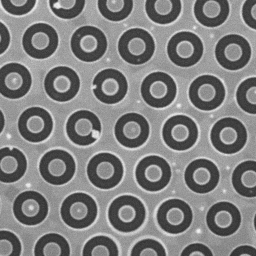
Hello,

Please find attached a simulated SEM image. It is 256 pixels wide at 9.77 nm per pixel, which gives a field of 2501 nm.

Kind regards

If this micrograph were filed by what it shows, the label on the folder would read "an array of small figures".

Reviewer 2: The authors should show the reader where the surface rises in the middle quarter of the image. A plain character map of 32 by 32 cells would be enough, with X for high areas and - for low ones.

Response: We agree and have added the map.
XXXXXXXXXXXXXXXXXXXXXXXXXXXXX---
--XXXXXXXX----XXXXXXXXXXXXXXXXXX
---XXXXX-------XXXXXX-----XXXXXX
----XXX--------XXXXX-------XXXXX
X---XXX---XXX---XXXX--------XXXX
X---XXX---XXX---XXX---XXX---XXX-
X---XXX---XXX---XXX---XXX---XXX-
---XXXX----X----XXX---XXX---XXX-
--XXXXXX-------XXXXX--------XXX-
XXXXXXXXX-----XXXXXX-------XXXXX
XXXXXXXXXXXXXXXXXXXXXX----XXXXXX
XXXX-XXXXXXXXXXXXXXXXXXXXXXXXXXX
XX------XXXXXXX----XXXXXXXXX--XX
X-------XXXXXX------XXXXXX------
X--XXX---XXXX---X----XXXX-------
---XXXX--XXXX--XXXX--XXXX---XX--
---XXXX--XXX---XXXX---XX---XXXX-
X---XX-XXXXXX--XXXX---XX---XXXX-
X-------XXXXX--------XXX----XX--
XX------XXXXX--------XXXX-------
XXX---XXXXXXXX------XXXXXX------
XXXXXXXXXXXXXXXXXXXXXXXXXXX----X
--XXXXXX-----XXXXXXXXXXXXXXXXXXX
---XXXX-------XXXXXX-----XXXXXXX
---XXX---------XXXX-------XXXXXX
---XXX---XXX---XXX---------XXXX-
---XXX--XXXX---XXX---XXX---XXX--
---XXX--XXXX---XXX--XXXX---XXX--
--XXXX---XX----XXX---XXX---XXX--
-XXXXXX-------XXXX--------XXXX--
XXXXXXXX-----XXXXXX-------XXXXX-
XXXXXXXXX--XXXXXXXXX----XXXXXXXX